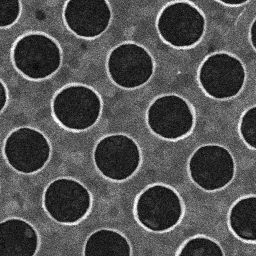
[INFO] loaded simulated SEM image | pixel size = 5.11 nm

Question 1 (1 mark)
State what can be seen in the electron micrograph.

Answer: a regular array of holes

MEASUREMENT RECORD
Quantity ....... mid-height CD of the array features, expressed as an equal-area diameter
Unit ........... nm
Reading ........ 232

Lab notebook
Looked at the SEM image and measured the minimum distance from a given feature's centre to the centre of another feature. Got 65 px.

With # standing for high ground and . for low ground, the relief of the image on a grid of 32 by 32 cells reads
..######.....########...####..##
..######......######.....#######
..######......######......######
#########....#######......#####.
###...####..########.....######.
##.....#########.####...########
##......######....##############
##......#####......#######....##
##.....######......######.....##
###...########.....######......#
###############...#######.....##
.#######....##############....##
.######......######....#########
#######......######.....#######.
#######.....######......######..
########....######......######..
##...##############.....######..
#.....#######....##############.
#.....######.....########...####
#.....######......######.....###
#.....######.....#######.....###
###.########.....#######.....###
#######..#####.#########.....###
######.....########..####...####
######.....#######....##########
######.....######......######...
######.....######......######...
#..####...#######.....#######...
....##############...########...
.....######....###############..
.....######.....#######....#####
....#######.....#######.....####